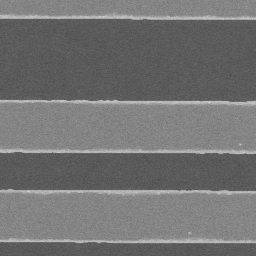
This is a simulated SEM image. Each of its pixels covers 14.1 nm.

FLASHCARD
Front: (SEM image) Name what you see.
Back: lines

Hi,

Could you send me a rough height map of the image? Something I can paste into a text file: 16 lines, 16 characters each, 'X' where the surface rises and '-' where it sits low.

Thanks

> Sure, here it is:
XXXXXXXXXXXXXXXX
----------------
----------------
----------------
----------------
----------------
XXXXXXXXXXXXXXXX
XXXXXXXXXXXXXXXX
XXXXXXXXXXXXXXXX
----XXXXXXXXXXXX
----------------
----------------
XXXXXXXXXXXXXXXX
XXXXXXXXXXXXXXXX
XXXXXXXXXXXXXXXX
----------------